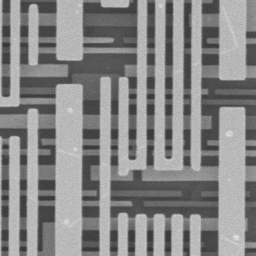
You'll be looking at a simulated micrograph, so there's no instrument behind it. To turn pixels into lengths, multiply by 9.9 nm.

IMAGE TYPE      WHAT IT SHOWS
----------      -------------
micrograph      wiring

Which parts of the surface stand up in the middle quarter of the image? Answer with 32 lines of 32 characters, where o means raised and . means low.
...................o...oo..ooo..
...................o...oo..ooo..
..................oo...oo..ooo..
..........o...oo..oo...oo..ooo..
.........oo...oo..oo...oo..ooo..
oooo.....oo...oo..oo...oo..ooo..
ooooo....oo...oo..oo...oo..ooo..
ooooo....oo...oo..oo...oo..ooo..
ooooo....oo...oo..oo...oo..ooo..
ooooo....oo...oo..oo...oo..ooo..
oooo.....oo...oo..oo...oo..ooo..
oooo.....oo...oo..oo...oo..ooo..
oooo.....oo...oo..oo...oo..ooo..
oooo.....oo...oo..oo...oo..ooo..
oooo.....oo...oo..oo...oo..ooo..
oooo.....oo...oo..oo...oo..ooo..
oooo.....oo...oo..oo...oo..ooo..
oooo.....oo...oo..oo...oo..ooo..
oooo.....oo...oo..oo...oo..ooo..
oooo.....oo...oo..oo...oo..ooo..
oooo.....oo...oo..oo...oo..ooo..
oooo.....oo...oo..oo...oo..ooo..
oooo.....oo...oo..oo...oo..ooo..
oooo.....oo...oo..oo...oo..ooo..
oooo.....oo...oooooo...ooooooo..
oooo.....oo...oooooo...ooooooo..
oooo.....oo...oo................
oooo.....oo...oo................
oooo.....oo.....................
oooo.....oo.....................
oooo.....oo.....................
oooo.....oo.....................